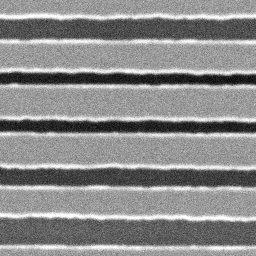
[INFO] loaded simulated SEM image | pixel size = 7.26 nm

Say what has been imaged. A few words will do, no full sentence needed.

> lines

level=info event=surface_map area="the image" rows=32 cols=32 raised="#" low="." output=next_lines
################################
################################
................................
................................
................................
################################
################################
################################
################################
................................
................................
################################
################################
################################
################################
................................
................................
################################
################################
################################
################################
................................
................................
##################.#######.####.
################################
################################
################################
..............................#.
................................
................................
................................
################################